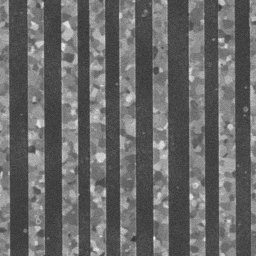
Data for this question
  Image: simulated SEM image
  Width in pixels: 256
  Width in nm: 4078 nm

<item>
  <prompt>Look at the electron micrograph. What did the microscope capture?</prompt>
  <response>parallel lines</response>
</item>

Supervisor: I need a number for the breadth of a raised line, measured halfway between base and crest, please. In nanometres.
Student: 247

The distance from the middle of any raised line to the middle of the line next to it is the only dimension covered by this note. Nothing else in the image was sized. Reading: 506 nm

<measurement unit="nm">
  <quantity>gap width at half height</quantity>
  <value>249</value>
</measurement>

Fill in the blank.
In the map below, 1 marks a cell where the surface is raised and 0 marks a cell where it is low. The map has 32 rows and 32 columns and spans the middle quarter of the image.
11100001110000111100001111000001
11100001110000111100001111000001
11100001110000111100001111000001
11100001110000111100001111000001
11100001110000111100001111000001
11100001110000111100001111000001
11100001110000111100001111000001
11100001110000111100001111000001
11100001110000111100001111000001
11100001110000111100001111000001
11100001110000111100001111000001
11100001110000111100001111000001
11100001110000111100001111000001
11100001110000111100001111000001
11100001110000111100001111000001
11100001110000111100000111000001
11100001110000111100000111000001
11100001110000111100000111000001
11100001110000111100000111000001
11100001110000111100001111000001
11100001110000111100000111000001
11100001110000111100000111000000
11100001110000111100001111000000
11100001110000111100001111000000
11100001110000111100001111000000
11100001110000111100001111000000
11100001110000111100001111000000
11100001110000111100001111000000
11100001110000111100000111000000
11100001110000111100001111000000
11100001110000111100001111000000
11100001110000111100001111000000